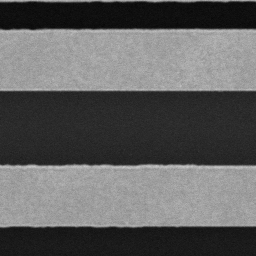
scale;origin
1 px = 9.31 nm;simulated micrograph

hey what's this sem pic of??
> lines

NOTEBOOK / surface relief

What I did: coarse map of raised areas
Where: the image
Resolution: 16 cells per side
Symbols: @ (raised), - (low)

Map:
----------------
----------------
@@@@@@@@@@@@@@@@
@@@@@@@@@@@@@@@@
@@@@@@@@@@@@@@@@
@@@@@@@@@@@@@@@@
----------------
----------------
----------------
----------------
@@@@@@@@@@@@@@@@
@@@@@@@@@@@@@@@@
@@@@@@@@@@@@@@@@
@@@@@@@@@@@@@@@@
----------------
----------------